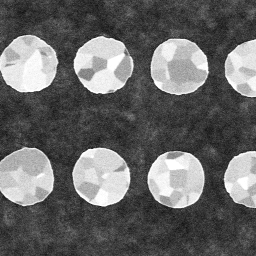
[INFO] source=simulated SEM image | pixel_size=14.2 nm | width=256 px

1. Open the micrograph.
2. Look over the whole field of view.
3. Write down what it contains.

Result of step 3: raised bodies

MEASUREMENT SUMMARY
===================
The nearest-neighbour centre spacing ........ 1070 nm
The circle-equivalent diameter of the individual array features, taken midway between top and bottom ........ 806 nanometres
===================